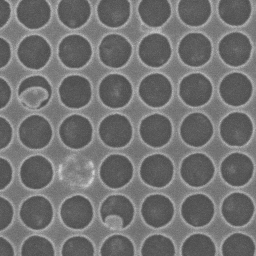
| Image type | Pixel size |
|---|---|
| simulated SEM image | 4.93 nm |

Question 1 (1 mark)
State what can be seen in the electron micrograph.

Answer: a regular array of holes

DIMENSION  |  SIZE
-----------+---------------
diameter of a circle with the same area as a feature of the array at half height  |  168 nm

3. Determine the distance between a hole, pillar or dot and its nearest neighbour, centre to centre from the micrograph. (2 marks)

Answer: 197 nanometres